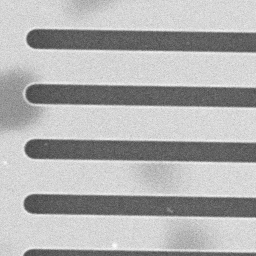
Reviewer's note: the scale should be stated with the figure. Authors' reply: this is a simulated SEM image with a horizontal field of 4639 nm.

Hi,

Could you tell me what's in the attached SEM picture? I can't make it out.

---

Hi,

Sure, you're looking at groups of lines, slits or small figures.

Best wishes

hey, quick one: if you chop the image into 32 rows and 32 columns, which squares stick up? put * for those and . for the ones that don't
********************************
********************************
********************************
********************************
***.............................
***.............................
************************........
********************************
********************************
********************************
****.....***********************
***.............................
***.............................
******************************..
********************************
********************************
********************************
****...........*****************
***.............................
***.............................
********************************
********************************
********************************
********************************
***...................**********
***.............................
***.............................
********************************
********************************
********************************
********************************
***.............................